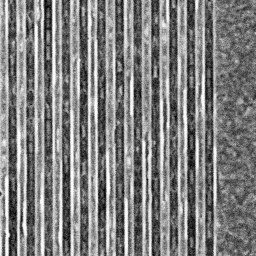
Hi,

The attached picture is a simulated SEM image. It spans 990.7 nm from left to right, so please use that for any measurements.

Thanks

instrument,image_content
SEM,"parallel lines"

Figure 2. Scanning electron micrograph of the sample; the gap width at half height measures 32.4 nm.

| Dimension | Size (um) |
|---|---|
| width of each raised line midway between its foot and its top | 0.0363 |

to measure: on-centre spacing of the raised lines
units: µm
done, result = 0.0691